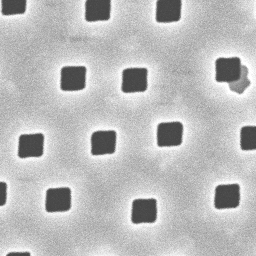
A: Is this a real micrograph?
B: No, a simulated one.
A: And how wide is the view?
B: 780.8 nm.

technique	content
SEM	a regular array of holes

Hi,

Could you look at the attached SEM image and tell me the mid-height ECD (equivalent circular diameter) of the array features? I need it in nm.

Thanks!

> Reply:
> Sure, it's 84.7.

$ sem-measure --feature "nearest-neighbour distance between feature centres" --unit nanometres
197